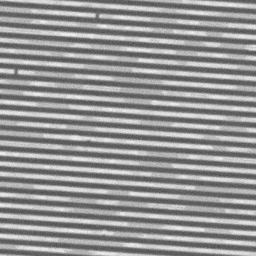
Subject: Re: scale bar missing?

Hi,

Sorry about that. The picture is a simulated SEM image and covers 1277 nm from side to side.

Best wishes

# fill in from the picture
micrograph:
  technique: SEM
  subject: parallel lines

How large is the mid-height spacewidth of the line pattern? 0.0324 micrometres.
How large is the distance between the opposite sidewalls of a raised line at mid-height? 18 nm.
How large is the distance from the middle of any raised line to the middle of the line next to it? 10.3 px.